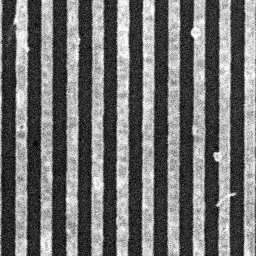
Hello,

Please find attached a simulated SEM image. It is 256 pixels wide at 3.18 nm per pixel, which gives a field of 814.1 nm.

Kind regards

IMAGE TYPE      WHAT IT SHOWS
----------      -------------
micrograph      parallel lines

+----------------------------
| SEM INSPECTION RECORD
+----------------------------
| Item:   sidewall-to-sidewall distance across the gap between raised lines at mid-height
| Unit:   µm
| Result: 0.0482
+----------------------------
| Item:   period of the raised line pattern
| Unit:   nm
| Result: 80.8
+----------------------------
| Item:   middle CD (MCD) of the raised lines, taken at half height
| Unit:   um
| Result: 0.0342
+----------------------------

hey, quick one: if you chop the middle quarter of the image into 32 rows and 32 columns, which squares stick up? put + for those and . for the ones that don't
.++....+++....++....++....+++...
.++....+++....++....++....+++...
.++....+++....++....++....+++...
.++....+++...+++....++....+++...
.++....+++...+++....++....+++...
.++....+++....+.....++....+++...
.++....+++...+++....++....+++...
.++....+++...+++....++....+++...
.++....+++...+++....++....+++...
.++....+++...+.+....++....+++...
.++....+++...+++....++....+++...
.++....+++...+++....++....+++...
.++....+++...+++....++....+++...
.++....+++...+++....++....+++...
.++....+++...+++....++....+++...
.++....+++...+++....++....+++...
.++....+++...+++....++....+++...
.++....+++...+++....++....+++...
.++....+++...+++....++....+++...
.++....+++...+++....++....+++...
.++....+++...+++....++....+++...
.++....+++...+++....++....+++...
.++....+++...+++....++....+++...
.++....+++....++....++....+++...
.++....+++....++....++....+++...
.++....+++...+++....++....+++...
.++....+++...+++....++....+++...
.++....+++...+++....++....+++...
.++....+++...+++....++....+++...
.++....+++...+.+....++....+++...
.++....+++...+.+....++....+++...
.++....+++...+++....++....+++...